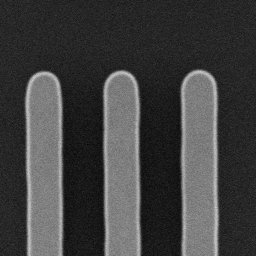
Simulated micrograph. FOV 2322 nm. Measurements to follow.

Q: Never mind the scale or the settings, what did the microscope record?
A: groups of lines, slits or small figures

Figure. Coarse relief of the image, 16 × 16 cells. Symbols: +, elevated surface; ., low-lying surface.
................
................
................
................
................
..++...++..++...
..++...++..+++..
..++...++..+++..
..++...++..+++..
..++...++..+++..
..++...++..+++..
..++...++..+++..
..++...++..+++..
..++...++..+++..
..++...++..+++..
..++...++..+++..